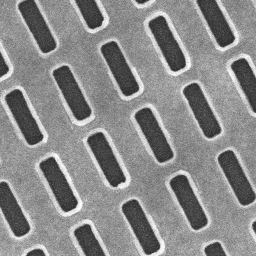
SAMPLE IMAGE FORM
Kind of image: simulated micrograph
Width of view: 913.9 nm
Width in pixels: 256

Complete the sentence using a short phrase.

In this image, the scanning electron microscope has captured a regular array of holes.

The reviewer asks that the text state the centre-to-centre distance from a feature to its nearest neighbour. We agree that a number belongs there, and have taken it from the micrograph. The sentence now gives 0.192 um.